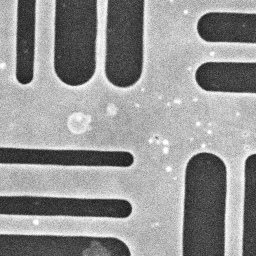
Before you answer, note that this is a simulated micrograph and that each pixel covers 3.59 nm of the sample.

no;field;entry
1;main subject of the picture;groups of lines, slits or small figures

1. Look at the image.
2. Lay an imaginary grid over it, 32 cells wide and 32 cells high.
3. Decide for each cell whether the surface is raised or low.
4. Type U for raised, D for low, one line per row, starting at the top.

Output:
UUDDDUUDDDDDUDDDDDUUUUUUUUUUUUUU
UUDDDUUDDDDDUDDDDDUUUUUUUUDDDDUU
UUDDDUUDDDDDUDDDDDUUUUUUUDDDDDDD
UUDDDUUDDDDDUDDDDDUUUUUUUDDDDDDD
UUDDUUUDDDDDUDDDDDUUUUUUUDDDDDDD
UUDDUUUDDDDDUDDDDDUUUUUUUUUUUUUD
UUDDUUUDDDDDUDDDDDUUUUUUUUUUUUUU
UUDDUUUDDDDDUDDDDDUUUUUUUUUUUUUU
UUDDUUUDDDDDUDDDDDUUUUUUUDDDDDDD
UUDDUUUDDDDDUDDDDDUUUUUUDDDDDDDD
UUUUUUUUDDDUUUDDDUUUUUUUUDDDDDDD
UUUUUUUUUUUUUUUUUUUUUUUUUUUDDDDD
UUUUUUUUUUUUUUUUUUUUUUUUUUUUUUUU
UUUUUUUUUUUUUUUUUUUUUUUUUUUUUUUU
UUUUUUUUUUUUUUUUUUUUUUUUUUUUUUUU
UUUUUUUUUUUUUUUUUUUUUUUUUUUUUUUU
UUUUUUUUUUUUUUUUUUUUUUUUUUUUUUUU
UUUUUUUUUUUUUUUUUUUUUUUUUUUUUUUU
DDDUUUUUUUUUUUUUUUUUUUUUUUUUUUUU
DDDDDDDDDDDDDDDDDUUUUUUUDDDUUUUD
DDDDDDDDDDDDDDDDDUUUUUUDDDDDUUUD
UUUUUUUUUUUUUUUUUUUUUUUDDDDDUUDD
UUUUUUUUUUUUUUUUUUUUUUUDDDDDUUDD
UUUUUUUUUUUUUUUUUUUUUUUDDDDDUUDD
DDDDDDDUUUUUUUUUUUUUUUUDDDDDUUDD
DDDDDDDDDDDDDDDDUUUUUUUDDDDDUUDD
DDDDDDDDDDDDDDDDUUUUUUUDDDDDUUDD
UUUUUUUUUUUUUUUUUUUUUUUDDDDDUUDD
UUUUUUUUUUUUUUUUUUUUUUUDDDDDUUDD
DDDDDDDDDDDUUUUUUUUUUUUDDDDDUUDD
DDDDDDDDDDDDDDDDUUUUUUUDDDDDUUDD
DDDDDDDDDDDUUDDDUUUUUUUDDDDDUUDD